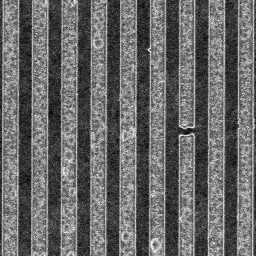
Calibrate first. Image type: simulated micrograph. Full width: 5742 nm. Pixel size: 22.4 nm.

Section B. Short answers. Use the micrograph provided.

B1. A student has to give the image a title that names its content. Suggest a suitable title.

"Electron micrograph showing parallel lines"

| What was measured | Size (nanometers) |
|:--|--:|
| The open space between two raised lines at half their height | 311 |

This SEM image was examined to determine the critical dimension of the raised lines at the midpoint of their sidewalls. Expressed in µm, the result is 0.35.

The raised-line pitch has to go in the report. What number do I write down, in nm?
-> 659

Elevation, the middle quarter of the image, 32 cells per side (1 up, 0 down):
11100001111000111100001110000111
11100001111000111100001110000111
11100001111000111100001110000111
11100001111000111100001110000111
11100001111000111100001110000111
11100001111000111100001110000111
11100001111000111100001110000111
11100001111000111100001110000111
11100001111000111100001110000111
11100001111000111100001110000111
11100001111000111100001110000111
11100001111000111100001110000111
11100001111000111100001110000111
11100001111000111100001110000111
11100001111000111100001110000111
11100001111000111100001110000111
11100001110000111100001110000000
11100001110000111100001110000000
11100001110000111100001110000111
11100001110000111100001110000111
11100001110000111100001110000111
11100001110000111100001110000111
11100001110000111100001110000111
11100001110000111100001110000111
11100001110000111100001110000111
11100001110000111100001110000111
11100001110000111100001110000111
11100001110000111100001110000111
11100001110000111100001110000111
11100001110000111100001110000111
11100001110000111100001110000111
11100001110000111100001110000111